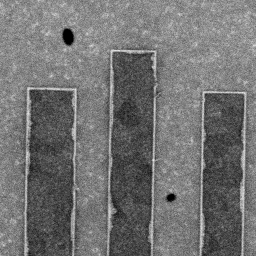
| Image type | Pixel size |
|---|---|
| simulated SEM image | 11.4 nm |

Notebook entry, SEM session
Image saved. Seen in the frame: one or a few lines or trenches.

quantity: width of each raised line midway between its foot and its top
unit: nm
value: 505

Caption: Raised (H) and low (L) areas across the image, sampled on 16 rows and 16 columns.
LLLLLLLLLLLLLLLL
LLLLLLLLLLLLLLLL
LLLLLLLLLLLLLLLL
LLLLLLLHHHLLLLLL
LLLLLLLHHHLLLLLL
LLLLLLLHHHLLLLLL
LLHHHLLHHHLLLHHL
LLHHHLLHHHLLLHHL
LLHHHLLHHHLLLHHL
LLHHHLLHHHLLLHHL
LLHHHLLHHHLLLHHL
LLHHHLLHHHLLLHHL
LLHHHLLHHHLLLHHL
LLHHHLLHHHLLLHHL
LLHHHLLHHLLLLHHL
LLHHHLLHHLLLLHHL